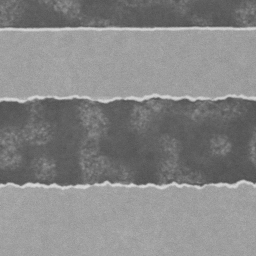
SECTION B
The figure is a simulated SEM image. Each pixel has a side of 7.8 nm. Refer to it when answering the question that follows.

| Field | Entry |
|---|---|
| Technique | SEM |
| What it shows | one or a few lines or trenches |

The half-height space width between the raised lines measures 683 nm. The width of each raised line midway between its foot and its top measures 539 nm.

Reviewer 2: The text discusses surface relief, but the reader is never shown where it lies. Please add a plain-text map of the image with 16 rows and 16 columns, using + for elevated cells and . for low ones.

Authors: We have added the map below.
................
................
++++++++++++++++
++++++++++++++++
++++++++++++++++
++++++++++++++++
................
................
................
................
................
...............+
++++++++++++++++
++++++++++++++++
++++++++++++++++
++++++++++++++++